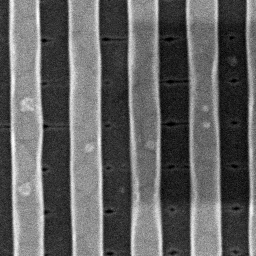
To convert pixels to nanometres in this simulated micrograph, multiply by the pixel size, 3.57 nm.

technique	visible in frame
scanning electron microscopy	wiring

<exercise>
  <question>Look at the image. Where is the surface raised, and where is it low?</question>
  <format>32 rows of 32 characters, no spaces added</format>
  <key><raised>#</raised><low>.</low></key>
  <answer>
.####....###....####...####....#
.####....###....####...####....#
.##......###....####...####....#
.####....###....####...####....#
.####....###....####...####....#
.####....###....####....###....#
.####....###....###.....###....#
.####....###....###.....###....#
.####....###....###.....###....#
.####....###....####....###....#
.####....###....####....###....#
.####....###....####....###....#
.####....###....####....###....#
.####....###....####....###.....
.####....###....####....###....#
.####....###....####....###....#
.####....###....####....###....#
....#....###....####....###....#
.#..#....###.....###....###....#
..###....####....###....###....#
..###....####....###....###....#
..###....####....###....###....#
..###....####....###....###....#
..###....####....###....###....#
..###....####....###....###....#
..###....####....###....###....#
..###....####....###....###....#
..###....####....###....###....#
..###....####....###....####...#
..###....####....###....####...#
..###....####...####....####...#
..###....####...####....####...#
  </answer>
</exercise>